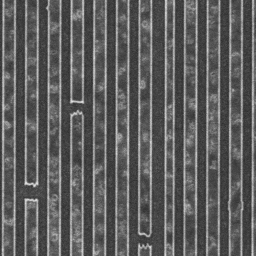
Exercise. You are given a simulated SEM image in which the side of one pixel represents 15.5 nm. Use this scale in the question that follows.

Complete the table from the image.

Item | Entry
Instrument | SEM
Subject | parallel lines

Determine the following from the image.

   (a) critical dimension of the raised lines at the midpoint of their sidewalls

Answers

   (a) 0.182 micrometres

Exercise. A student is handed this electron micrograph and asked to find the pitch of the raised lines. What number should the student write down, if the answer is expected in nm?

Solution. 351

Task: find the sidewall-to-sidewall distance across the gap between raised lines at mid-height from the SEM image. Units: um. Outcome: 0.168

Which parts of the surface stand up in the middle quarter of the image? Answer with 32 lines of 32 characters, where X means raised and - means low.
--XXX---XX---XXX---XXX----X---XX
--XXX---XX---XXX---XXX----X---XX
--XXX---XX---XXX---XXX----X---XX
--XXX---XX---XXX---XXX----X---XX
--XXX---XX---XXX---XXX----X---XX
--XXX---XX---XXX---XXX----X---XX
--XXX---XX---XXX---XXX----X---XX
--XXX---XX---XXX---XXX----X---XX
--XXX---XX---XXX---XXX----X---XX
--------XX---XXX---XXX----X---XX
--------XX---XXX---XXX----X---XX
--------XX---XXX---XXX----X---XX
--XXX---XX---XXX---XXX---XX---XX
--XXX---XX---XXX---XXX---XX---XX
--XXX---XX---XXX---XXX---XX---XX
--XXX---XX---XXX---XXX---XX---XX
--XXX---XX---XXX---XXX---XX---XX
--XXX---XX---XXX---XXX---XX---XX
--XXX---XX---XXX---XXX---XX---XX
--XXX---XX---XXX---XXX---XX---XX
--XXX---XX---XXX---XXX---XX---XX
--XXX---XX---XXX---XXX---XX---XX
--XXX---XX---XXX---XXX---XX---XX
--XXX---XX---XXX---XXX---XX---XX
--XXX---XX---XXX---XXX---XX---XX
--XXX---XX---XXX---XXX---XX---XX
--XXX---XX---XXX---XXX---XX---XX
--XXX---XX---XXX---XXX---XX---XX
--XXX---XX---XXX---XXX---XX---XX
--XXX---XX---XXX---XXX---XX---XX
--XXX---XX---XXX---XXX---XX---XX
--XXX---XX---XXX---XXX---XX---XX